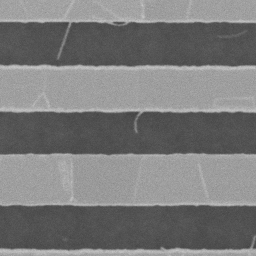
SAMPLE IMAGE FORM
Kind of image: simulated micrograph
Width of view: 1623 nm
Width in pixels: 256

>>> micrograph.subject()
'lines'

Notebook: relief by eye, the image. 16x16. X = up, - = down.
XXXXXXXXXXXXXXXX
----------------
----------------
----------------
XXXXXXXXXXXXXXXX
XXXXXXXXXXXXXXXX
XXXXXXXXXXXXXXXX
----------------
----------------
----------------
XXXXXXXXXXXXXXXX
XXXXXXXXXXXXXXXX
XXXXXXXXXXXXXXXX
----------------
----------------
----------------